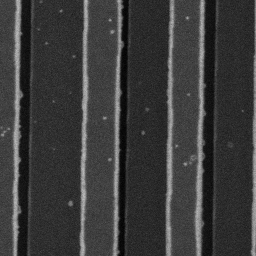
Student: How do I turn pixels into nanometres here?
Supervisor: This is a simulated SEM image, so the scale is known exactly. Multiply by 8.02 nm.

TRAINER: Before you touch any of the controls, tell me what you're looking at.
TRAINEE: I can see lines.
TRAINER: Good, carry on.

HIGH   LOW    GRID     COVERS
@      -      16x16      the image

@----@@@---@@---
@----@@@---@@---
@----@@@---@@---
@----@@----@@---
@----@@----@@---
@----@@----@@---
@----@@----@@---
@----@@----@@---
@----@@----@@---
@----@@----@@---
@----@@----@@---
@----@@----@@---
@----@@---@@@---
@----@@---@@----
@----@@---@@----
@----@@---@@----